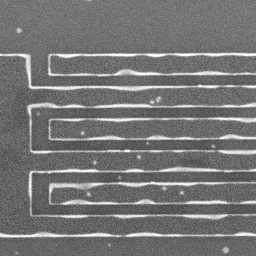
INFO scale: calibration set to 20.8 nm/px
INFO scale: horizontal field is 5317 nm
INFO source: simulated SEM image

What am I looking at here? groups of lines, slits or small figures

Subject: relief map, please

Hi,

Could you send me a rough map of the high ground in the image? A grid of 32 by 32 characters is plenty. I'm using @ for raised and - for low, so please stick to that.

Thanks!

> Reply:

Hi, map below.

--------------------------------
--------------------------------
--------------------------------
--------------------------------
--------------------------------
--------------------------------
--------------------------------
@@@---@@@@@@@@@@@@@@@@@@@@@@@@@@
@@@@--@@@@@@@@@@@@@@@@@@@@@@@@@@
@@@@----------------------------
@@@@----------------------------
@@@@@@@@@@@@@@@@@@@@@@@@@@@@@@@@
@@@@@@@@@@@@@@@@@@@@@@@@@@@@@@@@
@@@@----------------------------
@@@@----------------------------
@@@@--@@@@@@@@@@@@@@@@@@@@@@@@@@
@@@@--@@@@@@@@@@@@@@@@@@@@@@@@@@
@@@@----------------------------
@@@@----------------------------
@@@@@@@@@@@@@@@@@@@@@@@@@@@@@@@@
@@@@@@@@@@@@@@@@@@@@@@@@@@@@@@@@
@@@@----------------------------
@@@@----------------------------
@@@@--@@@@@@@@@@@@@@@@@@@@@@@@@@
@@@@--@@@@@@@@@@@@@@@@@@@@@@@@@@
@@@@----------------------------
@@@@----------------------------
@@@@@@@@@@@@@@@@@@@@@@@@@@@@@@@@
@@@@@@@@@@@@@@@@@@@@@@@@@@@@@@@@
--------------------------------
--------------------------------
--------------------------------